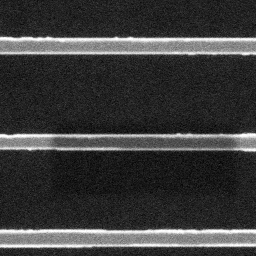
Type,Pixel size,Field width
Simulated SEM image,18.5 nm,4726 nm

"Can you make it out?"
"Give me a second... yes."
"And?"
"lines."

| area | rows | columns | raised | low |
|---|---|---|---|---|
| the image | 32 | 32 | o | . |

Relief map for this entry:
................................
................................
................................
................................
................................
oooooooooooooooooooooooooooooooo
oooooooooooooooooooooooooooooooo
................................
................................
................................
................................
................................
................................
................................
................................
................................
................................
oooooooooooooooooooooooooooooooo
oooooooooooooooooooooooooooooooo
................................
................................
................................
................................
................................
................................
................................
................................
................................
................................
oooooooooooooooooooooooooooooooo
oooooooooooooooooooooooooooooooo
................................